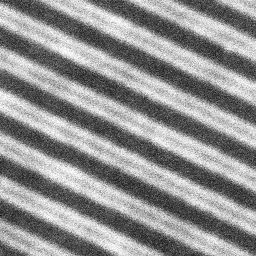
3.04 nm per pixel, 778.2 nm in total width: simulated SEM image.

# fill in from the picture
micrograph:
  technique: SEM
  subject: parallel lines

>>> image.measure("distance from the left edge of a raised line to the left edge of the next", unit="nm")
118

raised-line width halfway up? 45.5 nanometres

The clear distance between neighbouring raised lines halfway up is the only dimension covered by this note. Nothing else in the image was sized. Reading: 72.2 nm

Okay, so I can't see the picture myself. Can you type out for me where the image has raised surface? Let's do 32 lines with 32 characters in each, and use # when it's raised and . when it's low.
......#####.......####.......###
##......#####.......####.......#
####.......####.......####......
.#####.......####.......####....
...#####.......####.......####..
......####.......####.......####
#.......####.......####.......##
###.......####.......####.......
.####.......####.......####.....
...####.......####.......####...
.....####.......####.......####.
.......####.......####.......###
##.......####.......####.......#
####.......####.......#####.....
..####.......####.......#####...
....####.......####.......#####.
......####.......####.......####
#.......####.......#####.......#
###.......####.......#####......
.####.......#####......#####....
...####.......#####......#####..
.....#####......#####.......####
#......####.......#####.......##
##.......#####......#####.......
#####......#####.......####.....
..#####......#####.......####...
....#####.......####.......####.
.......####.......####.......###
##......#####.......####.......#
####......#####.......####......
.#####.......####.......####....
...#####.......####.......####..